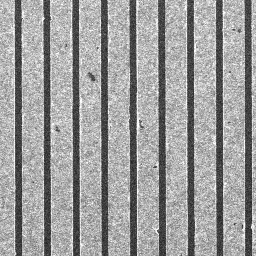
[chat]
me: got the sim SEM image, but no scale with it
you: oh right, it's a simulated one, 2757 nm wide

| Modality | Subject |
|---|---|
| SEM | parallel lines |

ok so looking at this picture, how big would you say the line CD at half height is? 206 nm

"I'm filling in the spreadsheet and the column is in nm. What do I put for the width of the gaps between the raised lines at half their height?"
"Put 82.1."